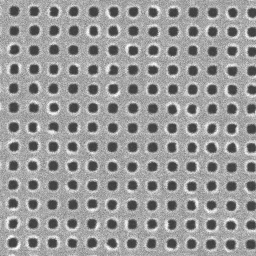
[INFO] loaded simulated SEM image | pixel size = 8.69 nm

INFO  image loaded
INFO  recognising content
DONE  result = a regular array of holes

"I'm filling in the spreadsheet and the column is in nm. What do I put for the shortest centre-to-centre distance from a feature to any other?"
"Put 166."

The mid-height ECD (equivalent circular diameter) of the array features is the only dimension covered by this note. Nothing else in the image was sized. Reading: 10.7 px